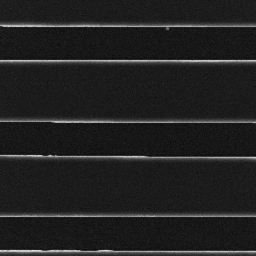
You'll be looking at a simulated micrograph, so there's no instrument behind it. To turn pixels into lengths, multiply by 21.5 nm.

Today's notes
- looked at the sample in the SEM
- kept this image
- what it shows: lines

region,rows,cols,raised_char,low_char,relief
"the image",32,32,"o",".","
oooooooooooooooooooooooooooooooo
oooooooooooooooooooooooooooooooo
oooooooooooooooooooooooooooooooo
................................
................................
................................
................................
................................
oooooooooooooooooooooooooooooooo
oooooooooooooooooooooooooooooooo
oooooooooooooooooooooooooooooooo
oooooooooooooooooooooooooooooooo
oooooooooooooooooooooooooooooooo
oooooooooooooooooooooooooooooooo
oooooooooooooooooooooooooooooooo
................................
................................
................................
................................
oooooo..........................
oooooooooooooooooooooooooooooooo
oooooooooooooooooooooooooooooooo
oooooooooooooooooooooooooooooooo
oooooooooooooooooooooooooooooooo
oooooooooooooooooooooooooooooooo
oooooooooooooooooooooooooooooooo
oooooooooooooooooooooooooooooooo
................................
................................
................................
................................
oooooooooooooooooooooooooooooooo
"